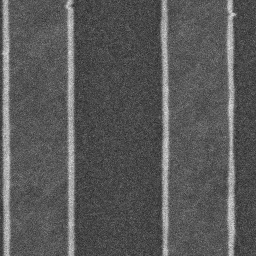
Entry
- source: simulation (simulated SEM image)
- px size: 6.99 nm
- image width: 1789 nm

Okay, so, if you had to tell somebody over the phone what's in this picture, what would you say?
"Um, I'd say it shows one or a few lines or trenches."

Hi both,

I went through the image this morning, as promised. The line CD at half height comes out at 0.461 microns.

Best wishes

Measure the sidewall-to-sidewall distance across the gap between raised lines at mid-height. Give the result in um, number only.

0.658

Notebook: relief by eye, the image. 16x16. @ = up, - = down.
@@@@------@@@@--
@@@@------@@@@--
@@@@------@@@@--
@@@@------@@@@--
@@@@------@@@@--
@@@@------@@@@--
@@@@------@@@@--
@@@@------@@@@--
@@@@------@@@@--
@@@@------@@@@--
@@@@------@@@@--
@@@@------@@@@--
@@@@------@@@@--
@@@@------@@@@--
@@@@------@@@@--
@@@@------@@@@@-